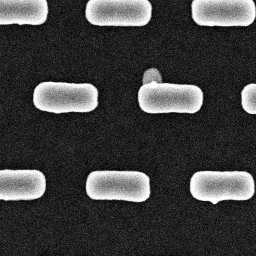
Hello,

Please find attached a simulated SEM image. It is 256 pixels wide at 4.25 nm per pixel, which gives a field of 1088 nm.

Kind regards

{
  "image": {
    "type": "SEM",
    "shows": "raised bodies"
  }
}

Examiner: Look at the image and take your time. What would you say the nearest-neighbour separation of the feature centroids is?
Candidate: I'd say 432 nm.